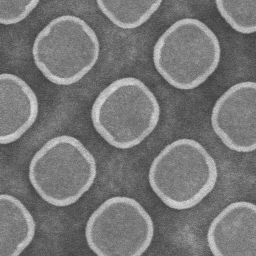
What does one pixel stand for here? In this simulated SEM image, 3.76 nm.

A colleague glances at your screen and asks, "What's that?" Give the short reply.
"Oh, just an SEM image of raised bodies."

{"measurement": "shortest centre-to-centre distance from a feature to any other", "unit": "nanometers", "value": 320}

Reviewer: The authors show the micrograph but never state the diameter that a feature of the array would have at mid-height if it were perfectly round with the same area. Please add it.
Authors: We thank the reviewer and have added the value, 0.235 micrometres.